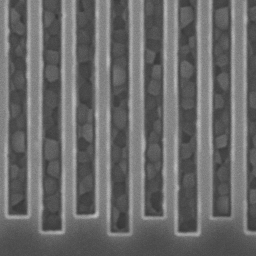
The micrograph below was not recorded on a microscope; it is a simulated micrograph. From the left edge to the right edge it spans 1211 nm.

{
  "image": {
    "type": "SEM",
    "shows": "parallel lines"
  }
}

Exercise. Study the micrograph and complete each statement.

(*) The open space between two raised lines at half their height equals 89.9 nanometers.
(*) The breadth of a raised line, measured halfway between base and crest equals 69.8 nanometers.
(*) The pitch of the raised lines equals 161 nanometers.